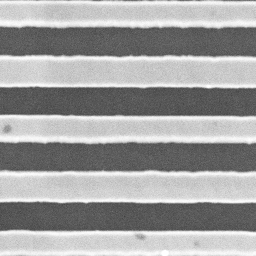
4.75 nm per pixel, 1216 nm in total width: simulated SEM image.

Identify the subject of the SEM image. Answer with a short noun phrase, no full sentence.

lines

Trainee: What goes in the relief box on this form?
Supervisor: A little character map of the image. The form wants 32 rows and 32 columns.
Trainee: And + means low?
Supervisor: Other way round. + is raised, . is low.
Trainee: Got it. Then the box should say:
++++++++++++++++++++++++++++++++
++++++++++++++++++++++++++++++++
++++++++++++++++++++++++++++++++
................................
................................
................................
................................
++++++++++++++++++++++++++++++++
++++++++++++++++++++++++++++++++
++++++++++++++++++++++++++++++++
++++++++++++++++++++++++++++++++
................................
................................
................................
++++++++++......................
++++++++++++++++++++++++++++++++
++++++++++++++++++++++++++++++++
++++++++++++++++++++++++++++++++
................................
................................
................................
+.......++..+++...++.....+++....
++++++++++++++++++++++++++++++++
++++++++++++++++++++++++++++++++
++++++++++++++++++++++++++++++++
................................
................................
................................
................................
++++++++++++++++++++++++++++++++
++++++++++++++++++++++++++++++++
++++++++++++++++++++++++++++++++